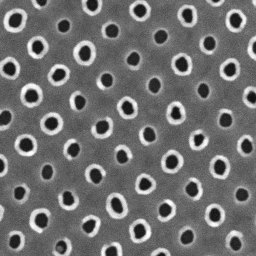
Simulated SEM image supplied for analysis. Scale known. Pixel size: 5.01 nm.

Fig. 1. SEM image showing a regular array of holes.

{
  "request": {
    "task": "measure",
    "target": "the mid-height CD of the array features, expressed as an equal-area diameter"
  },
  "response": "0.0678 µm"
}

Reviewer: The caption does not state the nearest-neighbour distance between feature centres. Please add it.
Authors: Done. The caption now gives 169 nanometers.